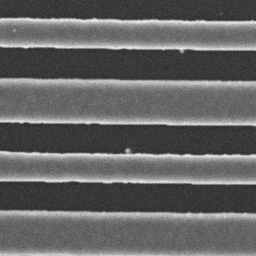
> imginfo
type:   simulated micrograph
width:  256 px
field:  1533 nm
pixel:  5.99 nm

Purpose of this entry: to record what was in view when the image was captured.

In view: lines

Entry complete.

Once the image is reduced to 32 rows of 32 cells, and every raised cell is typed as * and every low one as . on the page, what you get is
................................
................................
***************....*............
********************************
********************************
********************************
................................
................................
................................
................................
********************************
********************************
********************************
********************************
********************************
....................************
................................
................................
................................
********************************
********************************
********************************
********************************
................................
................................
................................
*********.......................
********************************
********************************
********************************
********************************
********************************